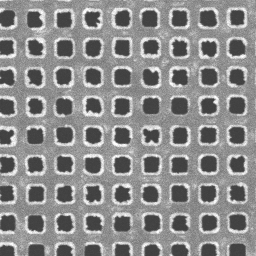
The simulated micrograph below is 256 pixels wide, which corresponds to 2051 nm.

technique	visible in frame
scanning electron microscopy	a regular array of holes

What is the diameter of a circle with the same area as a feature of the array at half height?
16.9 px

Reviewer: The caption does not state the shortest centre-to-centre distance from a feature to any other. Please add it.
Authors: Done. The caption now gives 0.227 microns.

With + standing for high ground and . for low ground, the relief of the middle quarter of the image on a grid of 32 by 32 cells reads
++++++++++++++++++++++++++++++++
.+++++..+++++...++++..+++++...++
..+++....+++.....+++....+++....+
..+++....+++.....+++....+++....+
.+++++...++++....+++....+++....+
+++++++++++++++++++++..+++++++++
++++++++++++++++++++++++++++++++
++++++++++++++++++++++++++++++++
++++++..+++++..++++++..++++...++
..++++...++++....+++....+++....+
..+++....++++....+++....+++....+
..++++...++++....+++....+++....+
..+++++++++++...+++++..+++++..++
++++++++++++++++++++++++++++++++
++++++++++++++++++++++++++++++++
++++++++++++++++++++++++++++++++
..++++...++++...++++.+.+++++...+
..+++....++++....+++....+++....+
..+++....++++....+++....+++....+
.+++++...++++....+++++.++++....+
++++++++++++++++++++++++++++++++
++++++++++++++++++++++++++++++++
++++++++++++++++++++++++++++++++
..++++...++++...++++....+++...++
..+++....++++....+++....+++....+
..+++....++++....+++....+++....+
..++++...++++....+++....+++....+
++++++++++++++++++++++++++++++++
++++++++++++++++++++++++++++++++
++++++++++++++++++++++++++++++++
.+++++..++++++.++++++.+++++...++
..++++...++++...++++...++++....+